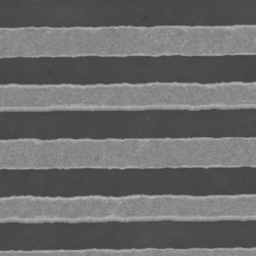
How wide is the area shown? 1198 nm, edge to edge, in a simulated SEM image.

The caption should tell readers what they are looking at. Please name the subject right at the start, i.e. lines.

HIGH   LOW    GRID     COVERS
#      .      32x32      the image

................................
................................
................................
...###...#..####################
################################
################################
################################
................................
................................
................................
...............#..#######..#####
################################
################################
###################....##.......
................................
................................
................................
.####.##########################
################################
################################
################################
................................
................................
................................
...#.......##...########..######
################################
################################
#.#####.##......................
................................
................................
................................
################################